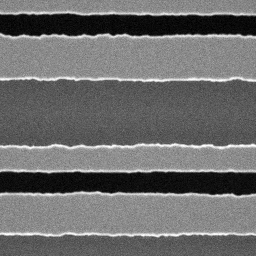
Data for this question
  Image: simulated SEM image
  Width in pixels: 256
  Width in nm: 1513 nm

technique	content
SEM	lines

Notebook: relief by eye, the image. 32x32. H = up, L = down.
HHHHHHHHHHHHHHHHHHHHHHHHHHHHHHHH
HHHHHHHHHHHHHHHHHHHHHHHHHHHHHHHH
LLLLLLLLLLLLLLLLLLLLLLLLLLLLLLLL
LLLLLLLLLLLLLLLLLLLLLLLLLLLLLLLL
HLLLLHHHLLHLHHHHLLLLLLHHHHHHHHLL
HHHHHHHHHHHHHHHHHHHHHHHHHHHHHHHH
HHHHHHHHHHHHHHHHHHHHHHHHHHHHHHHH
HHHHHHHHHHHHHHHHHHHHHHHHHHHHHHHH
HHHHHHHHHHHHHHHHHHHHHHHHHHHHHHHH
HHHHHHHHHHHHHHHHHHHHHHHHHHHHHHHH
LLLLLLLLLLLLLLLLLLLLLLLLLLLLLLLL
LLLLLLLLLLLLLLLLLLLLLLLLLLLLLLLL
LLLLLLLLLLLLLLLLLLLLLLLLLLLLLLLL
LLLLLLLLLLLLLLLLLLLLLLLLLLLLLLLL
LLLLLLLLLLLLLLLLLLLLLLLLLLLLLLLL
LLLLLLLLLLLLLLLLLLLLLLLLLLLLLLLL
LLLLLLLLLLLLLLLLLLLLLLLLLLLLLLLL
LLLLLLLLLLLLLLLLLLLLLLLLLLLLLLLL
HHHHHHHHHHHHHHHHHHHHHHHHHHHHHHHH
HHHHHHHHHHHHHHHHHHHHHHHHHHHHHHHH
HHHHHHHHHHHHHHHHHHHHHHHHHHHHHHHH
LLLLLHHLLLLLLLLHHLHLLLLLLLLLLLLL
LLLLLLLLLLLLLLLLLLLLLLLLLLLLLLLL
LLLLLLLLLLLLLLLLLLLLLLLLLLLLLLLL
HHHHHHHHHHHHHHHHHHHHHHHHHHHHHHHH
HHHHHHHHHHHHHHHHHHHHHHHHHHHHHHHH
HHHHHHHHHHHHHHHHHHHHHHHHHHHHHHHH
HHHHHHHHHHHHHHHHHHHHHHHHHHHHHHHH
HHHHHHHHHHHHHHHHHHHHHHHHHHHHHHHH
LLLLLLLLLLLLLLLLLLLLLLLLLLLLLLLL
LLLLLLLLLLLLLLLLLLLLLLLLLLLLLLLL
LLLLLLLLLLLLLLLLLLLLLLLLLLLLLLLL